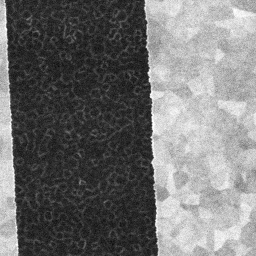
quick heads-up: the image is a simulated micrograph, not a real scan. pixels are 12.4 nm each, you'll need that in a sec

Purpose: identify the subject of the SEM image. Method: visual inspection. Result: one or a few lines or trenches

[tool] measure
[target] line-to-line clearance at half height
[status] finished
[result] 1740 nanometres